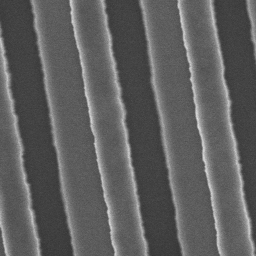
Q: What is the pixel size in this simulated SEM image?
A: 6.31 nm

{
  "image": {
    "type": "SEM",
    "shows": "lines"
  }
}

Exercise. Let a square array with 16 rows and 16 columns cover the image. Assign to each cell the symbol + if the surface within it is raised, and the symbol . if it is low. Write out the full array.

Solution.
..+++++..++++...
..+++++..++++...
..+++++..+++++..
...++++..+++++..
...++++...++++..
+..++++...++++..
+..+++++..++++..
+..+++++..++++..
+..+++++..+++++.
+...++++..+++++.
+...++++...++++.
++..++++...++++.
++..+++++..++++.
++..+++++..++++.
++..+++++..+++++
++...++++..+++++